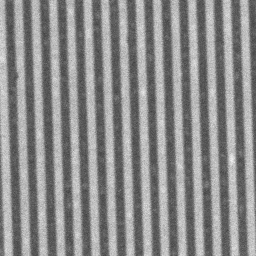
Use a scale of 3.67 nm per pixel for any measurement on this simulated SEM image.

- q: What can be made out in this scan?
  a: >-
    parallel lines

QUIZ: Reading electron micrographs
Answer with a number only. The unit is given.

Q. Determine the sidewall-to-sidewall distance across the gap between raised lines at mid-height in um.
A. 0.0371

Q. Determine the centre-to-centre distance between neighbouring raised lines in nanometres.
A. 63.7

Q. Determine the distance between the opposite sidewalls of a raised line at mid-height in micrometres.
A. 0.028